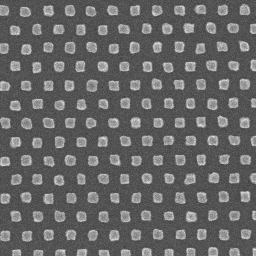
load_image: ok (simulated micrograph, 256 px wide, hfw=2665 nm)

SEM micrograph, a regular array of raised bodies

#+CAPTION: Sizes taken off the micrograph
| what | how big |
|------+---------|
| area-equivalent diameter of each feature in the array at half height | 0.108 µm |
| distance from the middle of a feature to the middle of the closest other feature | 0.216 µm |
